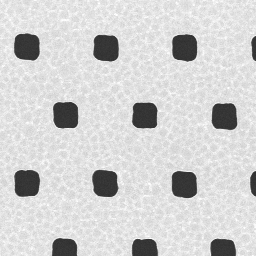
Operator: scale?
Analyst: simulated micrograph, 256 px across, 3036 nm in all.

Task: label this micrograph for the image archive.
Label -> a regular array of holes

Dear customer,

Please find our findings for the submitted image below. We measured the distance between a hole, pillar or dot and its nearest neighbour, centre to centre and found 926 nm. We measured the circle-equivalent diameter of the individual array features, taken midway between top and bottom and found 326 nanometers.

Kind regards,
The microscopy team